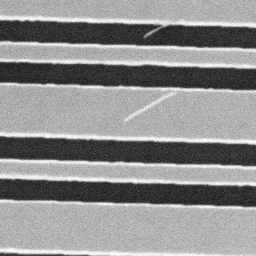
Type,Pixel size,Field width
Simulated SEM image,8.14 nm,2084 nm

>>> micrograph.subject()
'lines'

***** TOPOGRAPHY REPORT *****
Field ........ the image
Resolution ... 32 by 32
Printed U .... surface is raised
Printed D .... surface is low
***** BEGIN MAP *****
UUUUUUUUUUUUUUUUUUUUUUUUUUUUUUUU
UUUUUUUUUUUUUUUUUUUUUUUUUUUUUUUU
DDDDDUUUUUUUUUUUUUUUUUUUUUUUUUUU
DDDDDDDDDDDDDDDDDDDDDDDDDDDDDDDD
DDDDDDDDDDDDDDDDDDDDDDDDDDDDDDDD
UUUUUUUUUDDDDDDDDDDDDDDDDDDDDDDD
UUUUUUUUUUUUUUUUUUUUUUUUUUUUUUUU
UUUUUUUUUUUUUUUUUUUUUUUUUUUUUUUU
DDDDDDDDDDDDDDDDDDDDDDDDDDDDDDDD
DDDDDDDDDDDDDDDDDDDDDDDDDDDDDDDD
UUUDDDDDDDDDDDDDDDDDDDDDDDDDDDDD
UUUUUUUUUUUUUUUUUUUUUUUUUUUUUUUU
UUUUUUUUUUUUUUUUUUUUUUUUUUUUUUUU
UUUUUUUUUUUUUUUUUUUUUUUUUUUUUUUU
UUUUUUUUUUUUUUUUUUUUUUUUUUUUUUUU
UUUUUUUUUUUUUUUUUUUUUUUUUUUUUUUU
UUUUUUUUUUUUUUUUUUUUUUUUUUUUUUUU
DDDDDDDDDDDDDDDDDUUUUUUUUUUUUUUU
DDDDDDDDDDDDDDDDDDDDDDDDDDDDDDDD
DDDDDDDDDDDDDDDDDDDDDDDDDDDDDDDD
UUUUUUUUUUUUUUUUUUDDDDDDDDDDDDDD
UUUUUUUUUUUUUUUUUUUUUUUUUUUUUUUU
DDDDDDUUUUUUUUUUUUUUUUUUUUUUUUUU
DDDDDDDDDDDDDDDDDDDDDDDDDDDDDDDD
DDDDDDDDDDDDDDDDDDDDDDDDDDDDDDDD
UUUUUUUUUUUUUUUDDDDDDDDDDDDDDDDD
UUUUUUUUUUUUUUUUUUUUUUUUUUUUUUUU
UUUUUUUUUUUUUUUUUUUUUUUUUUUUUUUU
UUUUUUUUUUUUUUUUUUUUUUUUUUUUUUUU
UUUUUUUUUUUUUUUUUUUUUUUUUUUUUUUU
UUUUUUUUUUUUUUUUUUUUUUUUUUUUUUUU
DUUUUUUUUUUUUUUUUUUUUUUUUUUUUUUU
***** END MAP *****